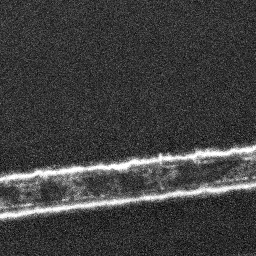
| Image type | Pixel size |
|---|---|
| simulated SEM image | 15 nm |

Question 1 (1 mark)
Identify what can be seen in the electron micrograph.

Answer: one or a few lines or trenches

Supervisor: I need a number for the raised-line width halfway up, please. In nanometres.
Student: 548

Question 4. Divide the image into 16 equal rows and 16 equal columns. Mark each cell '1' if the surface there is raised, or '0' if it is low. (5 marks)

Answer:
0000000000000000
0000000000000000
0000000000000000
0000000000000000
0000000000000000
0000000000000000
0000000000000000
0000000000000000
0000000000000000
0000000000000011
0000001111111111
1111111111111111
1111111100000000
0000000000000000
0000000000000000
0000000000000000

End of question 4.